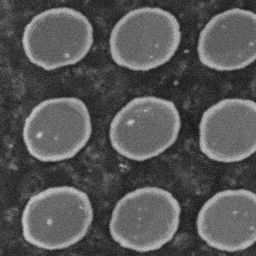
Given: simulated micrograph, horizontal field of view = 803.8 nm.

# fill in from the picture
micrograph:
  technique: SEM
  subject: raised bodies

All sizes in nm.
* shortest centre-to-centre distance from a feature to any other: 276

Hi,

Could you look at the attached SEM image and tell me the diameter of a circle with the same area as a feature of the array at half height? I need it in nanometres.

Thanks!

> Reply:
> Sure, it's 198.